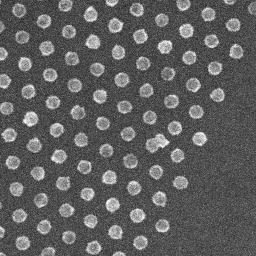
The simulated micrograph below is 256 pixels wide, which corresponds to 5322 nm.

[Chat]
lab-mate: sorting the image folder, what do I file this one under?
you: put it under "a regular array of raised bodies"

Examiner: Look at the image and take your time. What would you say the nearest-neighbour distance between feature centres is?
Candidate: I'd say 555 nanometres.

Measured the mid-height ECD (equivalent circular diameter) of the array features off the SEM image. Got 275 nanometres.